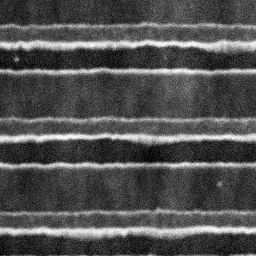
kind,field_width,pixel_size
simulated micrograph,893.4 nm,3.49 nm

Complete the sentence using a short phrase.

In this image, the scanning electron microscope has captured lines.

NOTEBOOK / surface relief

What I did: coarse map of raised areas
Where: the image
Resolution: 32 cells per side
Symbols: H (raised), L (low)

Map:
HHHHHHHHHHHHHHHHHHHHHHHHHHHHHHHH
HHHHHHHHHHHHHHHHHHHHHHHHHHHHHHHH
HHHHHHHHHHHHHHHHHHHHHHHHHHHHHHHH
HHHHHHHHHHHHHHHHHHHHHHHHHHHHHHHH
HHHHHHHHHHHHHHHHHHHHHHHHHHHHHHHH
HHLHLLHHHHHHHLHLHLLLLLHLLHHHHHHH
LLLLLLLLLLLLLLLLLLLLLLLLLLLLLLLL
LLLLLLLLLLLLLLLLLLLLLLLLLLLLLLLL
LLLLLLLLLLLLLLLLLLLLLLLLLLLLLLLL
HHHHHHHHHHHHHHHHHHHHHHHHHHHHHHHH
HHHHHHHHHHHHHHHHHHHHHHHHHHHHHHHH
HHHHHHHHHHHHHHHHHHHHHHHHHHHHHHHH
HHHHHHHHHHHHHHHHHHHHHHHHHHHHHHHH
HHHHHHHHHHHHHHHHHHHHHHHHHHHHHHHH
HHHHHHHHHHHHHHHHHHHHHHHHHHHHHHHH
HHHHHHHHHHHHHHHHHHHHHHHHHHHHHHHH
HHHHHHHHHHHHHHHHHHHHHHHHHHHHHHHH
LLLLLLLLLLLLLLLLLLLLLLLLLLLLLLLL
LLLLLLLLLLLLLLLLLLLLLLLLLLLLLLLL
LLLLLLLLLLLLLLLLLLLLLLLLLLLLLLLL
LLLLLLLHLLHLLLLLLLLHHLHHHHLHHLLL
HHHHHHHHHHHHHHHHHHHHHHHHHHHHHHHH
HHHHHHHHHHHHHHHHHHHHHHHHHHHHHHHH
HHHHHHHHHHHHHHHHHHHHHHHHHHHHHHHH
HHHHHHHHHHHHHHHHHHHHHHHHHHHHHHHH
HHHHHHHHHHHHHHHHHHHHHHHHHHHHHHHH
HHHHHHHHHHHHHHHHHHHHHHHHHHHHHHHH
HHHHHHHHHHHHHHHHHHHHHHHHHHHHHHHH
HHHHHHHHHHHHHHHHHHHHHHHHHHHHHHHH
LLLLLLLLLLLLLLLLLLLLLLLLLLLLLLLL
LLLLLLLLLLLLLLLLLLLLLLLLLLLLLLLL
LLLLLLLLLLLLLLLLLLLLLLLLLLLLLLLL